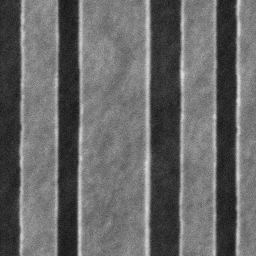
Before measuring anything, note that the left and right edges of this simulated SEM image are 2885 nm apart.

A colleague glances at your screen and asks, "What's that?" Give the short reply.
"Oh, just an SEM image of lines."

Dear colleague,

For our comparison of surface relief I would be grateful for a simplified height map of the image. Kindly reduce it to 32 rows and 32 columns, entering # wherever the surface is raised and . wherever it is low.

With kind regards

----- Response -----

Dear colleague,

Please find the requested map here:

...####...########.....####...##
...####...########.....####...##
...####...########.....####...##
...####...########.....####...##
...####...########.....####...##
...####...########.....####...##
...####...########.....####...##
...####...########.....####...##
...####...########.....####...##
...####...########.....####...##
...####...########.....####...##
...####...########.....####...##
...####...########.....####...##
...####...########.....####...##
...####...########.....####...##
...####...########.....####...##
...####...########.....####...##
...####...########.....####...##
...####...########.....####...##
...####...########.....####...##
...####...########.....####...##
...####...########.....####...##
...####...########.....####...##
...####...########.....####...##
...####...########.....####...##
...####...########.....####...##
...####...########.....####...##
...####...########.....####...##
...####...########.....####...##
...####...########.....####...##
...####...########.....####...##
...####...########.....####...##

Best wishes